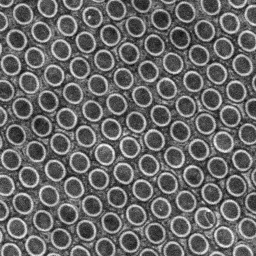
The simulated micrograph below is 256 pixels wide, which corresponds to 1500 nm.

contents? a regular array of raised bodies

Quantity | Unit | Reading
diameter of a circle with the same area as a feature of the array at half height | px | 19.1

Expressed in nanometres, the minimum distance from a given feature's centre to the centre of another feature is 149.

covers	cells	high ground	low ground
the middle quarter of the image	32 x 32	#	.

..####..####.......####..#####..
..####....#..###...####...###...
..####.......####..####........#
.......###...####...###.......##
......#####..####.......###...##
.###..#####...###......#####..##
####...####.......###...####....
#####...##.......#####..####....
####.......####...####.......##.
..##..##...####...####......####
.....####..#####...#........####
#....####...###.......####..####
##...####.......###...####...###
###...###.......####..####......
###.......###...####...###..#...
##........####..####.......####.
....###...####...###.......####.
...#####..####.......###...####.
#..#####...##.......#####...###.
#...####......####..#####.......
#........##...#####..####......#
#.......####..#####.......###..#
...##...####...###.......#####..
..####..####.......###...#####..
..####...###.......####...####..
..####.......###...####....##...
...###..#....####..####.......##
.......###...####....##..#....##
..#...#####..####.......####..##
.###...####...##..###...####...#
#####..####.......####..####....
#####.......###..#####...###....